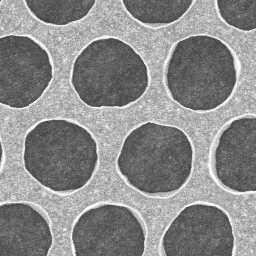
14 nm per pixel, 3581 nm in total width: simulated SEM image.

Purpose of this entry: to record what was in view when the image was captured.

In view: holes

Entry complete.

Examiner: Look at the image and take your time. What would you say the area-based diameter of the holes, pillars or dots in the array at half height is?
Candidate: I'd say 1020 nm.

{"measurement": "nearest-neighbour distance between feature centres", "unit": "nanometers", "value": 1300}